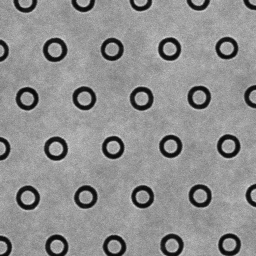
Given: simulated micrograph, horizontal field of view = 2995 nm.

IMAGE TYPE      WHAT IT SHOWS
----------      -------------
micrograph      a regular array of ring-shaped grooves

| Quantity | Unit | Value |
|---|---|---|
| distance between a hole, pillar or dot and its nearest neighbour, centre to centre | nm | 661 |